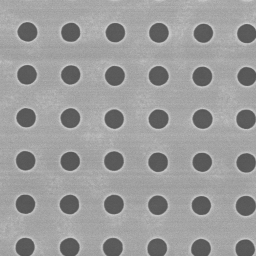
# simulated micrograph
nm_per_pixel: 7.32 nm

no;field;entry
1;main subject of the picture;a regular array of holes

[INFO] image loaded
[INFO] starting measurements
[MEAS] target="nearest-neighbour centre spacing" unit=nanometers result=315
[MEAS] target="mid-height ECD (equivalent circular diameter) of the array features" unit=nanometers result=142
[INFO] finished